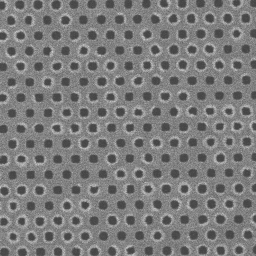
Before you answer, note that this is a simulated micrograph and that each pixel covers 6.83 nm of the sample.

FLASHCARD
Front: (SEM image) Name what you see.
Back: a regular array of holes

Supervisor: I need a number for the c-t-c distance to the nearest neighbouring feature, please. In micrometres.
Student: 0.12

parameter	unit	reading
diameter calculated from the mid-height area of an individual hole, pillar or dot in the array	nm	62.6